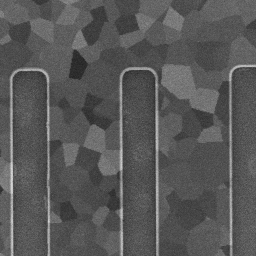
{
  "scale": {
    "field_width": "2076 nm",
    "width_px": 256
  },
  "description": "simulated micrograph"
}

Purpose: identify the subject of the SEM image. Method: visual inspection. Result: one or a few lines or trenches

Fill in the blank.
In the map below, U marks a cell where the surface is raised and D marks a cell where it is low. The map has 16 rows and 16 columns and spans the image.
UUUUUUUUUUUUUUUU
UUUUUUUUUUUUUUUU
UUUUUUUUUUUUUUUU
UUUUUUUUUUUUUUUU
UDDUUUUUDUUUUUUD
UDDUUUUUDDUUUUDD
UDDUUUUUDDUUUUDD
UDDUUUUUDDUUUUDD
UDDUUUUUDDUUUUDD
UDDUUUUUDDUUUUDD
UDDUUUUUDDUUUUDD
UDDUUUUUDDUUUUDD
UDDUUUUUDDUUUUDD
UDDUUUUUDDUUUUDD
UDDUUUUUDDUUUUDD
UDDUUUUUDDUUUUDD